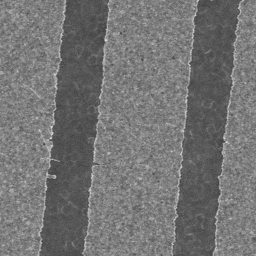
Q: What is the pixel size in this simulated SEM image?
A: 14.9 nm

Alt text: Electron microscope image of one or a few lines or trenches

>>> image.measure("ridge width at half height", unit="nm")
1210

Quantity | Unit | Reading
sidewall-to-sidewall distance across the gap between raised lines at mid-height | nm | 645